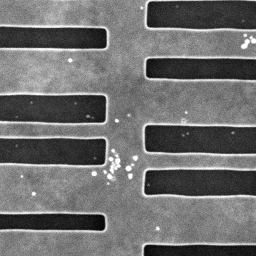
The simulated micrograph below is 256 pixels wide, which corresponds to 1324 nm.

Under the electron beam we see groups of lines, slits or small figures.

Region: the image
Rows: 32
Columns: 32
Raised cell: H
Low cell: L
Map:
HHHHHHHHHHHHHHHHHHLLLLLLLLLLLLLL
HHHHHHHHHHHHHHHHHHLLLLLLLLLLLLLL
HHHHHHHHHHHHHHHHHHLLLLLLLLLLLLLL
LLLLLLLLLLLLLHHHHHHLLLLLLLLLLLLL
LLLLLLLLLLLLLHHHHHHHHHHHHHHHHHHH
LLLLLLLLLLLLLHHHHHHHHHHHHHHHHHHH
HHHHHHHHHHHHHHHHHHHHHHHHHHHHHHHH
HHHHHHHHHHHHHHHHHHLLLLLLLLLLLLLL
HHHHHHHHHHHHHHHHHHLLLLLLLLLLLLLL
HHHHHHHHHHHHHHHHHHLLLLLLLLLLLLLL
HHHHHHHHHHHHHHHHHHHHHHHHHHHHHHHH
HHHHHHHHHHHHHHHHHHHHHHHHHHHHHHHH
LLLLLLLLLLLLLHHHHHHHHHHHHHHHHHHH
LLLLLLLLLLLLLHHHHHHHHHHHHHHHHHHH
LLLLLLLLLLLLLHHHHHHHHHHHHHHHHHHH
HHHHHHHHHHHHHHHHHHHHHHHHHHHHHHHH
HHHHHHHHHHHHHHHHHHLLLLLLLLLLLLLL
LLLLLLLLLLLLLHHHHHLLLLLLLLLLLLLL
LLLLLLLLLLLLLHHHHHLLLLLLLLLLLLLL
LLLLLLLLLLLLLHHHHHHHHHHHHHHHHHHH
HHLLLLLLLLLLLHHHHHHHHHHHHHHHHHHH
HHHHHHHHHHHHHHHHHHLLLLLLLLLLLLLL
HHHHHHHHHHHHHHHHHHLLLLLLLLLLLLLL
HHHHHHHHHHHHHHHHHHLLLLLLLLLLLLLL
HHHHHHHHHHHHHHHHHHHHHHHLLLLLLHHH
HHHHHHHHHHHHHHHHHHHHHHHHHHHHHHHH
HHHHHHHHHHHHHHHHHHHHHHHHHHHHHHHH
LLLLLLLLLLLLLHHHHHHHHHHHHHHHHHHH
LLLLLLLLLLLLLHHHHHHHHHHHHHHHHHHH
HHHHHHHHHHHHHHHHHHHHHHHHHHHHHHHH
HHHHHHHHHHHHHHHHHHHHHHHHHHHHHHHH
HHHHHHHHHHHHHHHHHHLLLLLLLLLLLLLL